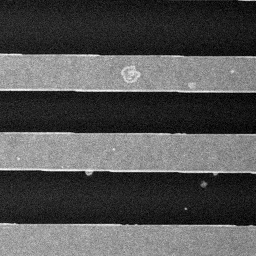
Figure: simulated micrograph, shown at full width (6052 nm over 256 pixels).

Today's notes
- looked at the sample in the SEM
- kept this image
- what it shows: lines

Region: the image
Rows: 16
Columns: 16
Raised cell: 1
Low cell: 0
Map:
0000000000000000
0000000000000000
0000000000000000
1111111000000000
1111111111111111
1111111111111111
0000000000000000
0000000000000000
1111111111111111
1111111111111111
1111111111111111
0000000000000000
0000000000000000
0000000000000000
1111111111111111
1111111111111111